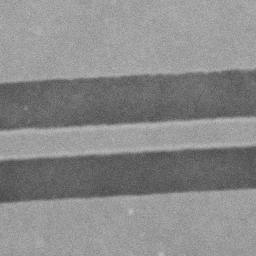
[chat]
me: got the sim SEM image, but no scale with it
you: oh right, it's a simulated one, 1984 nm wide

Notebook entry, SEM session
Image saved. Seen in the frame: lines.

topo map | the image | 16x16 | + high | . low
++++++++++++++++
++++++++++++++++
++++++++++++++++
++++++++++++++++
++++++++++++....
................
................
.............+++
++++++++++++++++
++++++++........
................
................
....++++++++++++
++++++++++++++++
++++++++++++++++
++++++++++++++++